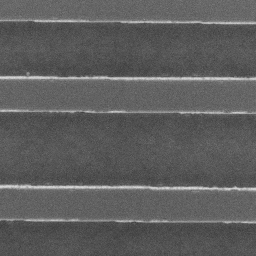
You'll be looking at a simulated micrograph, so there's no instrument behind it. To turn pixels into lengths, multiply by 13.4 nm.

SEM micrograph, lines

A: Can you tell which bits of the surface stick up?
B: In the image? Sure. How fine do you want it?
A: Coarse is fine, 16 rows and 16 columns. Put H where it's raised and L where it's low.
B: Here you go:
HHHHHHHHHHHHHHHH
LLLLLLLLLLLLLLLL
LLLLLLLLLLLLLLLL
LLLLLLLLLLLLLLLL
LLLLLLLLLLLLLLLL
HHHHHHHHHHHHHHHH
HHHHHHHHHHHHHHHH
LLLLLLLLLLLLLLLL
LLLLLLLLLLLLLLLL
LLLLLLLLLLLLLLLL
LLLLLLLLLLLLLLLL
LLLLLLLLLLLLLLLL
HHHHHHHHHHHHHHHH
HHHHHHHHHHHHHHHH
LLLLLLLLLLLLLLLL
LLLLLLLLLLLLLLLL